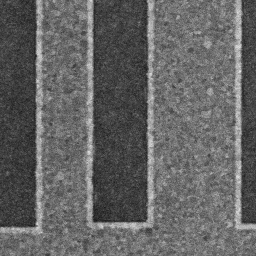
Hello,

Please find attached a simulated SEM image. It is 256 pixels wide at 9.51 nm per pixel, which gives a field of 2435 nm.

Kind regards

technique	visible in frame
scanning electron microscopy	one or a few lines or trenches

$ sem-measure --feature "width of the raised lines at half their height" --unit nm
662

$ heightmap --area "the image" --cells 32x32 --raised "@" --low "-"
-----@@@@@@--------@@@@@@@@@@@--
-----@@@@@@--------@@@@@@@@@@@--
-----@@@@@@--------@@@@@@@@@@@--
-----@@@@@@--------@@@@@@@@@@@--
-----@@@@@@--------@@@@@@@@@@@--
-----@@@@@@--------@@@@@@@@@@@--
-----@@@@@@--------@@@@@@@@@@@--
-----@@@@@@--------@@@@@@@@@@@--
-----@@@@@@--------@@@@@@@@@@@--
-----@@@@@@--------@@@@@@@@@@@--
-----@@@@@@--------@@@@@@@@@@@--
-----@@@@@@--------@@@@@@@@@@@--
-----@@@@@@--------@@@@@@@@@@@--
-----@@@@@@--------@@@@@@@@@@@--
-----@@@@@@--------@@@@@@@@@@@--
-----@@@@@@--------@@@@@@@@@@@--
-----@@@@@@--------@@@@@@@@@@@--
-----@@@@@@--------@@@@@@@@@@@--
-----@@@@@@--------@@@@@@@@@@@--
-----@@@@@@--------@@@@@@@@@@@--
-----@@@@@@--------@@@@@@@@@@@--
-----@@@@@@--------@@@@@@@@@@@--
-----@@@@@@--------@@@@@@@@@@@--
-----@@@@@@--------@@@@@@@@@@@--
-----@@@@@@--------@@@@@@@@@@@--
-----@@@@@@--------@@@@@@@@@@@--
-----@@@@@@--------@@@@@@@@@@@--
-----@@@@@@--------@@@@@@@@@@@--
-----@@@@@@@@@@@@@@@@@@@@@@@@@@@
@@@@@@@@@@@@@@@@@@@@@@@@@@@@@@@@
@@@@@@@@@@@@@@@@@@@@@@@@@@@@@@@@
@@@@@@@@@@@@@@@@@@@@@@@@@@@@@@@@